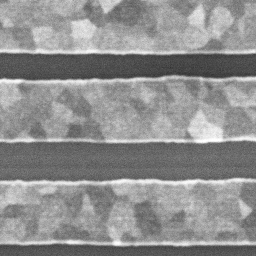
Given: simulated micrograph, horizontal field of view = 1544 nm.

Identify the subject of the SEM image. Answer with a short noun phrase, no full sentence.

lines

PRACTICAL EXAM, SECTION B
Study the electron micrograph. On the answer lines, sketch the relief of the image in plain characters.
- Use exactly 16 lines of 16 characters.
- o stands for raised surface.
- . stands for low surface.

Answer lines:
oooooooooooooooo
oooooooooooooooo
oooooooooooooooo
................
................
oooooooooooooooo
oooooooooooooooo
oooooooooooooooo
oooooooooooooooo
................
................
oooooooooooooooo
oooooooooooooooo
oooooooooooooooo
oooooooooooooooo
................